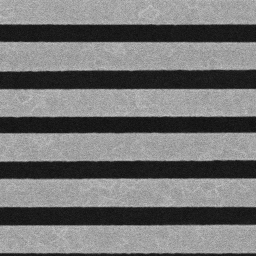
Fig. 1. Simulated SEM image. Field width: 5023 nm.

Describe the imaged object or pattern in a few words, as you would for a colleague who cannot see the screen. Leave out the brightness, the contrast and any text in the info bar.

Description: lines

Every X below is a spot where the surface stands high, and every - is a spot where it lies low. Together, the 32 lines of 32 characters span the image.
XXXXXXXXXXXXXXXXXXXXXXXXXXXXXXXX
XXXXXXXXXXXXXXXXXXXXXXXXXXXXXXXX
XXXXXXXXXXXXXXXXXXXXXXXXXXXXXXXX
--------------------------------
--------------------------------
XXXXXXXXXXXXXXXXXXXXXXXXXXXXXXXX
XXXXXXXXXXXXXXXXXXXXXXXXXXXXXXXX
XXXXXXXXXXXXXXXXXXXXXXXXXXXXXXXX
XXXXXXXXXXXXXXXXXXXXXXXXXXXXXXXX
--------------------------------
--------------------------------
XXXXXXXXXXXXXXXXXXXXXXXXXXXXXXXX
XXXXXXXXXXXXXXXXXXXXXXXXXXXXXXXX
XXXXXXXXXXXXXXXXXXXXXXXXXXXXXXXX
XXXXXXXXXXXXXXXXXXXXXXXXXXXXXXXX
--------------------------------
--------------------------------
XXXXXXXXXXXXXXXXXXXXXXXXXXXXXXXX
XXXXXXXXXXXXXXXXXXXXXXXXXXXXXXXX
XXXXXXXXXXXXXXXXXXXXXXXXXXXXXXXX
--------------------------------
--------------------------------
XXXX-XXXXXXXXXXXXXXXXXXXXXXXXXXX
XXXXXXXXXXXXXXXXXXXXXXXXXXXXXXXX
XXXXXXXXXXXXXXXXXXXXXXXXXXXXXXXX
XXXXXXXXXXXXXXXXXXXXXXXXXXXXXXXX
--------------------------------
--------------------------------
XXXXXXXXXXXXXXXXXXXXXXXXXXXXXXXX
XXXXXXXXXXXXXXXXXXXXXXXXXXXXXXXX
XXXXXXXXXXXXXXXXXXXXXXXXXXXXXXXX
XXXXXXXXXXXXXXXXXXXXXXXXXXXXXXXX